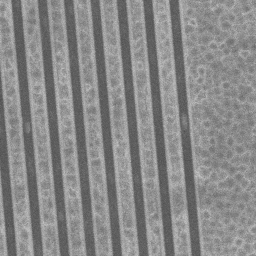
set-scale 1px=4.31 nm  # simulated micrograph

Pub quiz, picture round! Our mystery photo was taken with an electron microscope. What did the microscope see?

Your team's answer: parallel lines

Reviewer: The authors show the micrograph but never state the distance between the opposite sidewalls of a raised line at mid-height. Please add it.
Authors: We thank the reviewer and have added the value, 59.5 nm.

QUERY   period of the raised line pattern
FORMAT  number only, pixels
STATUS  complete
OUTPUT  26.2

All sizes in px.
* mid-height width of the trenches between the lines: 12.1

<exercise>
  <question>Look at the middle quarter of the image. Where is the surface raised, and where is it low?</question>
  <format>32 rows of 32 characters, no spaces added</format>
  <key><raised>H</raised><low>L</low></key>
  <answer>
HLLLHHHHLLLHHHLLLHHHHLLLHHHLLLLH
HLLLHHHHLLLHHHLLLLHHHLLLHHHLLLLH
HLLLLHHHLLLHHHLLLLHHHLLLHHHLLLLH
HLLLLHHHLLLHHHLLLLHHHLLLHHHLLLLH
HLLLLHHHLLLHHHLLLLHHHLLLHHHHLLLH
HLLLLHHHLLLHHHHLLLHHHLLLHHHHLLLH
HLLLLHHHLLLHHHHLLLHHHLLLHHHHLLLH
HHLLLHHHLLLHHHHLLLHHHLLLLHHHLLLH
HHLLLHHHLLLLHHHLLLHHHLLLLHHHLLLH
HHLLLHHHLLLLHHHLLLHHHHLLLHHHLLLH
HHLLLHHHLLLLHHHLLLHHHHLLLHHHLLLL
HHLLLHHHLLLLHHHLLLHHHHLLLHHHLLLL
HHLLLHHHLLLLHHHLLLLHHHLLLHHHLLLL
HHLLLHHHHLLLHHHLLLLHHHLLLHHHLLLL
HHLLLLHHHLLLHHHLLLLHHHLLLHHHLLLL
HHLLLLHHHLLLHHHLLLLHHHLLLHHHHLLL
HHLLLLHHHLLLHHHLLLLHHHLLLHHHHLLL
HHLLLLHHHLLLHHHHLLLHHHLLLHHHHLLL
HHHLLLHHHLLLHHHHLLLHHHLLLLHHHLLL
HHHLLLHHHLLLHHHHLLLHHHLLLLHHHLLL
HHHLLLHHHLLLLHHHLLLHHHHLLLHHHLLL
HHHLLLHHHLLLLHHHLLLHHHHLLLHHHLLL
HHHLLLHHHLLLLHHHLLLHHHHLLLHHHLLL
HHHLLLHHHLLLLHHHLLLLHHHLLLHHHLLL
HHHLLLHHHHLLLHHHLLLLHHHLLLHHHLLL
HHHLLLLHHHLLLHHHLLLLHHHLLLHHHLLL
HHHLLLLHHHLLLHHHLLLLHHHLLLHHHHLL
HHHLLLLHHHLLLHHHLLLLHHHLLLHHHHLL
HHHLLLLHHHLLLHHHHLLLHHHLLLHHHHLL
HHHLLLLHHHLLLHHHHLLLHHHLLLLHHHLL
HHHHLLLHHHLLLHHHHLLLHHHLLLLHHHLL
HHHHLLLHHHLLLLHHHLLLHHHLLLLHHHLL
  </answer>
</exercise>